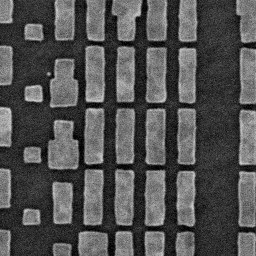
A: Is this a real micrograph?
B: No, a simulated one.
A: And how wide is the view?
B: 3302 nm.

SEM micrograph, wiring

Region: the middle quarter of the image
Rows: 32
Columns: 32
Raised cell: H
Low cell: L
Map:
HHLLLLHHHHLLLHHHHLLLLHHHHLLLLHHH
HHLLLLHHHHLLLHHHHLLLLHHHHLLLLHHH
HHLLLLHHHHLLLHHHHLLLLHHHHLLLLHHH
HHLLLLHHHHLLLHHHHLLLLHHHHLLLLHHH
HHHLLLHHHHLLLHHHHLLLLHHHHLLLLHHH
HHHLLLHHHHLLLHHHHLLLLHHHHLLLLHHH
HHHLLLHHHHLLLHHHHLLLLHHHHLLLLHHH
HHHLLLHHHHLLLHHHHLLLLHHHHLLLLHHH
HHHLLLHHHHLLLHHHHLLLLHHHHLLLLHHH
HHHLLLLLLLLLLLLLLLLLLLLLLLLLLLLH
LLLLLLLLLLLLLLLLLLLLLLLLLLLLLLLL
LLLLLLHHHHLLLLHHHLLLLHHHHLLLLHHH
LLLLLLHHHHLLLHHHHLLLLHHHHLLLLHHH
LLLLLLHHHHLLLHHHHLLLLHHHHLLLLHHH
HHLLLLHHHHLLLHHHHLLLLHHHHLLLLHHH
HHLLLHHHHHLLLHHHHLLLLHHHHLLLLHHH
HHLLLHHHHHLLLHHHHLLLLHHHHLLLLHHH
HHLLLHHHHHLLLHHHHLLLLHHHHLLLLHHH
HHLLLHHHHHLLLHHHHLLLLHHHHLLLLHHH
HHHLLHHHHHLLLHHHHLLLLHHHHLLLLHHH
HHHLLHHHHHLLLHHHHLLLLHHHHLLLLHHH
HHHHLHHHHHLLLHHHHLLLLHHHHLLLLHHH
HHHHLHHHHHLLLHHHHLLLLHHHHLLLLHHH
HHHHLHHHHHLLLHHHHLLLLHHHHLLLLHHH
HHHHLHHHHLLLLHHHHLLLLHHHHLLLLHHH
HHHLLLLLLLLLLLLLLLLLLLLLLLLLLLLL
LLLLLLHLLLLLLLLLLLLLLLLLLLLLLLLL
LLLLLHHHHHLLLHHHHLLLLHHHHLLLLHHH
LLLLLHHHHHLLLHHHHLLLLHHHHLLLHHHH
LLLLLHHHHHLLLHHHHLLLLHHHHLLLHHHH
HHLLLHHHHHLLLHHHHLLLLHHHHLLLHHHH
HHLLLHHHHLLLLHHHHLLLLHHHHLLLLHHH